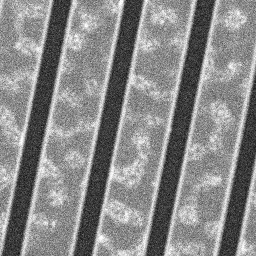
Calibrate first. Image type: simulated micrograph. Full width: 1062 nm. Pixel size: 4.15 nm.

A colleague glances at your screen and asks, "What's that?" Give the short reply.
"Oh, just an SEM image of one or a few lines or trenches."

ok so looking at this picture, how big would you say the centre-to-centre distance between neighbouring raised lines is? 0.292 µm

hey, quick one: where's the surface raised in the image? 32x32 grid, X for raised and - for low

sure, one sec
XXXXXX---XXXXXX---XXXXXX---XXXXX
XXXXXX---XXXXXX---XXXXXX---XXXXX
XXXXXX---XXXXXX---XXXXXX---XXXXX
XXXXXX--XXXXXXX--XXXXXXX--XXXXXX
XXXXXX--XXXXXXX--XXXXXXX--XXXXXX
XXXXX---XXXXXX---XXXXXX---XXXXXX
XXXXX---XXXXXX---XXXXXX---XXXXXX
XXXXX---XXXXXX---XXXXXX---XXXXXX
XXXXX--XXXXXXX--XXXXXXX--XXXXXXX
XXXXX--XXXXXXX--XXXXXXX--XXXXXXX
XXXX---XXXXXX---XXXXXX---XXXXXX-
XXXX---XXXXXX---XXXXXX---XXXXXX-
XXXX---XXXXXX---XXXXXX---XXXXXX-
XXXX--XXXXXXX--XXXXXXX--XXXXXXX-
XXXX--XXXXXXX--XXXXXXX--XXXXXXX-
XXX---XXXXXX---XXXXXX---XXXXXX--
XXX---XXXXXX---XXXXXX---XXXXXX--
XXX---XXXXXX---XXXXXX--XXXXXXX--
XXX--XXXXXXX--XXXXXXX--XXXXXXX--
XXX--XXXXXX---XXXXXXX--XXXXXXX--
XX---XXXXXX---XXXXXX---XXXXXX---
XX---XXXXXX---XXXXXX---XXXXXX---
XX---XXXXXX---XXXXXX--XXXXXXX---
XX--XXXXXXX--XXXXXXX--XXXXXXX--X
XX--XXXXXX---XXXXXXX--XXXXXXX--X
X---XXXXXX---XXXXXX---XXXXXX---X
X---XXXXXX---XXXXXX---XXXXXX---X
X---XXXXXX---XXXXXX--XXXXXXX--XX
X--XXXXXXX--XXXXXXX--XXXXXXX--XX
X--XXXXXX---XXXXXX---XXXXXXX--XX
---XXXXXX---XXXXXX---XXXXXX---XX
---XXXXXX---XXXXXX---XXXXXX---XX